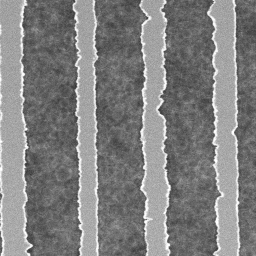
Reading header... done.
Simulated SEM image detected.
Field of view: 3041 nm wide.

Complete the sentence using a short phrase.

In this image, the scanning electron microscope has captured one or a few lines or trenches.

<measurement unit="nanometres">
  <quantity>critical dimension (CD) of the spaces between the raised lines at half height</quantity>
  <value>585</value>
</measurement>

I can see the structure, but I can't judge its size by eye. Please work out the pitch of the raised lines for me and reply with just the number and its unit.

831 nanometres